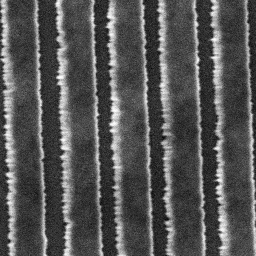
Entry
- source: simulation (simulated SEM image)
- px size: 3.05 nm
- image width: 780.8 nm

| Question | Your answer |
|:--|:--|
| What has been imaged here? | lines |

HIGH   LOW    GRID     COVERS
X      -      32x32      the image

XXXXX--XXXXX--XXXX--XXXX---XXXX-
XXXXX--XXXXX--XXXX--XXXX---XXXX-
XXXXX--XXXXX--XXXX--XXXXX--XXXX-
-XXXX--XXXXX--XXXX--XXXXX--XXXX-
XXXXX--XXXXX--XXXX--XXXXX--XXXX-
-XXXX---XXXX--XXXX--XXXXX--XXXX-
XXXXX--XXXXX--XXXX--XXXXX--XXXX-
-XXXX---XXXX--XXXX--XXXXX--XXXX-
-XXXX---XXXX--XXXX--XXXXX--XXXX-
-XXXX---XXXX--XXXX--XXXXX--XXXX-
-XXXX---XXXX--XXXX--XXXXX--XXXX-
-XXXX---XXXX--XXXX--XXXXX--XXXX-
-XXXX---XXXX--XXXX--XXXXX--XXXX-
-XXXX---XXXX--XXXX---XXXX--XXXX-
-XXXX---XXXX--XXXX---XXXX--XXXXX
-XXXX---XXXX--XXXX---XXXX--XXXXX
-XXXX---XXXX--XXXXX--XXXX--XXXXX
-XXXX---XXXX--XXXXX--XXXX--XXXXX
-XXXX---XXXX--XXXXX--XXXX--XXXXX
-XXXX---XXXX--XXXXX--XXXX--XXXXX
-XXXX---XXXX---XXXX--XXXX--XXXXX
-XXXX---XXXX---XXXX--XXXX--XXXXX
-XXXX---XXXX---XXXX--XXXX--XXXXX
-XXXX---XXXX---XXXX--XXXX--XXXXX
-XXXXX--XXXX---XXXX--XXXX--XXXXX
-XXXXX--XXXX---XXXX--XXXX---XXXX
-XXXXX--XXXXX--XXXX--XXXXX--XXXX
-XXXXX--XXXXX--XXXX--XXXXX--XXXX
-XXXXX--XXXXX--XXXX--XXXXX--XXXX
-XXXXX--XXXXX--XXXX--XXXXX--XXXX
-XXXXX--XXXXX--XXXX--XXXXX--XXXX
-XXXXX--XXXXX--XXXX--XXXXX--XXXX